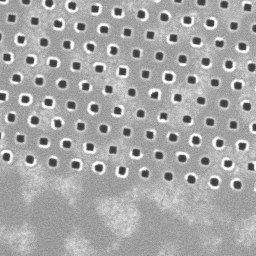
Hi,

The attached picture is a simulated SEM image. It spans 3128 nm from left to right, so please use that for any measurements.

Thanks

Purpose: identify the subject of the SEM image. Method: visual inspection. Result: a regular array of holes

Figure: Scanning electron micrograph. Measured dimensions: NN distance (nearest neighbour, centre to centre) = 22.6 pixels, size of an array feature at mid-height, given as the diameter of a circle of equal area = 0.107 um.